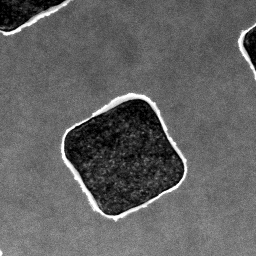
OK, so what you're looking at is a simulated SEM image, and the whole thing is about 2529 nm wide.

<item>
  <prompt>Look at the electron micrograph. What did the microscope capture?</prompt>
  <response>holes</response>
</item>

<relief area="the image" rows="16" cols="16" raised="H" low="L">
LLLLHHHHHHHHHHHH
LLHHHHHHHHHHHHHH
HHHHHHHHHHHHHHHL
HHHHHHHHHHHHHHHL
HHHHHHHHHHHHHHHH
HHHHHHHHHHHHHHHH
HHHHHHHLLHHHHHHH
HHHHHLLLLLHHHHHH
HHHHLLLLLLHHHHHH
HHHHLLLLLLLHHHHH
HHHHHLLLLLLLHHHH
HHHHHLLLLLLHHHHH
HHHHHHLLLLHHHHHH
HHHHHHHHHHHHHHHH
HHHHHHHHHHHHHHHH
HHHHHHHHHHHHHHHH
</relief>